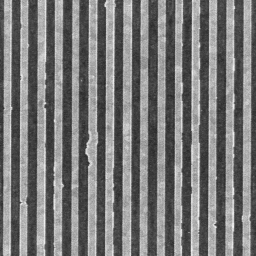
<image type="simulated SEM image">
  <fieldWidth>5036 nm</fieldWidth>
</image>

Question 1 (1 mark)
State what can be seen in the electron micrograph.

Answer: parallel lines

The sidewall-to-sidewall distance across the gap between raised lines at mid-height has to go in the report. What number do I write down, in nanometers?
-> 197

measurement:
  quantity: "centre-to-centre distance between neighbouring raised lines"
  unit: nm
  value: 337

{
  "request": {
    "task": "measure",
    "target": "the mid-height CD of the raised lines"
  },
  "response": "7.25 pixels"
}